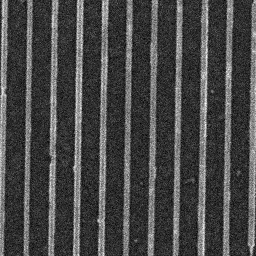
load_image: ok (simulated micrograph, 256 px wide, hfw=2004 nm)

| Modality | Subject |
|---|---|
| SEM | parallel lines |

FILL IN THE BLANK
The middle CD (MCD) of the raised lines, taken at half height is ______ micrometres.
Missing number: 0.0392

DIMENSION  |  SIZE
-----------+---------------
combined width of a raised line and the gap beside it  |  0.196 µm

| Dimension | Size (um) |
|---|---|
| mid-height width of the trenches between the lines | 0.157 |